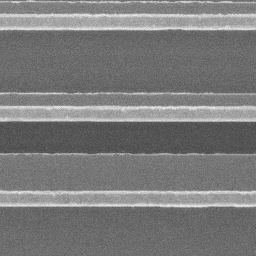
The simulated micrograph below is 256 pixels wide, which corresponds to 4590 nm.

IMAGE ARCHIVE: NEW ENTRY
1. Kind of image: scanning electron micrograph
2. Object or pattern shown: lines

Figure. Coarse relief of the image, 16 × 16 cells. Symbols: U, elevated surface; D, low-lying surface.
UUUUUUUUUUUUUUUU
UUUUUUUUUUUUUUUU
DDDDDDDDDDDDDDDD
DDDDDDDDDDDDDDDD
DDDDDDDDDDDDDDDD
DDDDDDDDDDDDDDDD
UUUUUUUUUUUUUUUU
UUUUUUUUUUUUUUUU
DDDDDDDDDDDDDDDD
DDDDDDDDDDDDDDDD
UUUUUUUUUUUUUUUU
UUUUUUUUUUUUUUUU
UUUUUUUUUUUUUUUU
DDDDDDDDDDDDDDDD
DDDDDDDDDDDDDDDD
DDDDDDDDDDDDDDDD